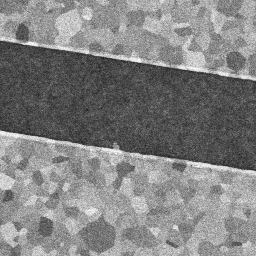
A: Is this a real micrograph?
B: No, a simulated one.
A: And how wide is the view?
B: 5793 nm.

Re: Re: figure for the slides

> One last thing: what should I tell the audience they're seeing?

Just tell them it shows one or a few lines or trenches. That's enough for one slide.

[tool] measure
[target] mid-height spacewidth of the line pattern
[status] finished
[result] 2120 nm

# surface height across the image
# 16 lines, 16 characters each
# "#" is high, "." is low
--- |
################
################
.###############
.......#########
.............###
................
................
................
#...............
#######.........
##############..
################
################
################
################
################